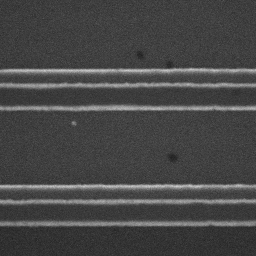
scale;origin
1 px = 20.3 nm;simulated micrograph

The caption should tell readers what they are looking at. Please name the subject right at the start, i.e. lines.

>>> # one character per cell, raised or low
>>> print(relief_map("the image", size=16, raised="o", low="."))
................
................
................
................
oooooooooooooooo
oooooooooooooooo
oooooooooooooooo
................
................
................
................
................
oooooooooooooooo
oooooooooooooooo
................
................